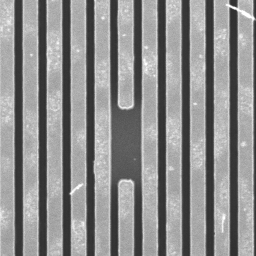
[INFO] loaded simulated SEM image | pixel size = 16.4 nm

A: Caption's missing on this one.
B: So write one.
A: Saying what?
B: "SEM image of parallel lines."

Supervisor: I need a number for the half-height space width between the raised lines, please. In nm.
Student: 129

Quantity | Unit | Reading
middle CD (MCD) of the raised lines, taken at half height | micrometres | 0.258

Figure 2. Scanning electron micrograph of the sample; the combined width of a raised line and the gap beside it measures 392 nm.